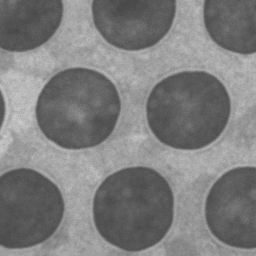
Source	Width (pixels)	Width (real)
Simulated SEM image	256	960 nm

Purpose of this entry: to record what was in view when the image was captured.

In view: holes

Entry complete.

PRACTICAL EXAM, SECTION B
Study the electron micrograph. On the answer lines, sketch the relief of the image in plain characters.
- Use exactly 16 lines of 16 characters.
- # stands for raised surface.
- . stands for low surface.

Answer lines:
....##.....##...
....##.....##...
...####...###...
################
####..#####..###
###....###....##
##......#.....##
##.....##.....##
###....###....##
################
########.#####..
...###.....##...
....##.....##...
....##.....##...
...###.....##...
..#####...####..